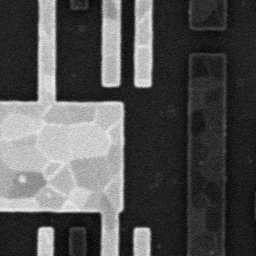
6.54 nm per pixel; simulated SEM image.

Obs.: wiring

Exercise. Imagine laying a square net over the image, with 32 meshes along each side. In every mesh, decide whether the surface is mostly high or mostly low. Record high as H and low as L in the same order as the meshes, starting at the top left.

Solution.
LLLLLHHLLHHLLHHLLHHLLLLLHHHHLLLL
LLLLLHHLLLLLLHHLLHHLLLLLHHHHLLLL
LLLLLHHLLLLLLHHLLHHLLLLLHHHHLLLL
LLLLLHHLLLLLLHHLLHHLLLLLHHHHLLLL
LLLLLHHLLLLLLHHLLHHLLLLLLLLLLLLL
LLLLLHHLLLLLLHHLLHHLLLLLLLLLLLLL
LLLLLHHLLLLLLHHLLHHLLLLLLLLLLLLL
LLLLLHHLLLLLLHHLLHHLLLLLHHHHLLLL
LLLLLHHLLLLLLHHLLHHLLLLLHHHHLLLL
LLLLLHHLLLLLLHHLLHHLLLLLHHHHLLLL
LLLLLHHLLLLLLHHLLHHLLLLLHHHHLLLL
LLLLLHHLLLLLLLLLLLLLLLLLHHHHLLLL
LLLLLHHLLLLLLLLLLLLLLLLLHHHHLLLL
HHHHHHHHHHHHHHHLLLLLLLLLHHHHLLLL
HHHHHHHHHHHHHHHLLLLLLLLLHHHHLLLL
HHHHHHHHHHHHHHHLLLLLLLLLHHHHLLLL
HHHHHHHHHHHHHHHLLLLLLLLLHHHHLLLL
HHHHHHHHHHHHHHHLLLLLLLLLHHHHLLLL
HHHHHHHHHHHHHHHLLLLLLLLLHHHHLLLL
HHHHHHHHHHHHHHHLLLLLLLLLHHHHLLLL
HHHHHHHHHHHHHHHLLLLLLLLLHHHHLLLL
HHHHHHHHHHHHHHHLLLLLLLLLHHHHLLLL
HHHHHHHHHHHHHHHLLLLLLLLLHHHHLLLL
HHHHHHHHHHHHHHHLLLLLLLLLHHHHLLLL
HHHHHHHHHHHHHHHLLLLLLLLLHHHHLLLL
HHHHHHHHHHHHHHHLLLLLLLLLHHHHLLLL
LLLLLLLLLLLLHHHLLLLLLLLLHHHHLLLL
LLLLLLLLLLLLLHHLLLLLLLLLHHHHLLLL
LLLLLLLLLLLLLHHLLLLLLLLLHHHHLLLL
LLLLLHHLLHHLLHHLLHHLLLLLHHHHLLLL
LLLLLHHLLHHLLHHLLHHLLLLLHHHHLLLL
LLLLLHHLLHHLLHHLLHHLLLLLHHHHLLLL